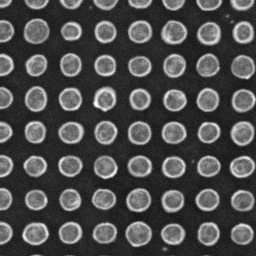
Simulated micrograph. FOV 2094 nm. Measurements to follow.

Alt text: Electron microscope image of a regular array of raised bodies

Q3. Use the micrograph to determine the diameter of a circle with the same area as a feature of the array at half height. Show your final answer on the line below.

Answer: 177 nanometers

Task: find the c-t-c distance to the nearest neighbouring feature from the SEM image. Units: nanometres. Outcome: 272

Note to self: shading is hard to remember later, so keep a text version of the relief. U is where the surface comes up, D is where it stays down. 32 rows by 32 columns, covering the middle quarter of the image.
UUUUDDDDUUUUUDDDUUUUUUDDDUUUUUDD
UUUUDDDDUUUUUDDDDUUUUUDDDUUUUUDD
UUUDDDDDDUUUDDDDDUUUUDDDDDUUUDDD
DDDDDDDDDDDDDDDDDDDDDDDDDDDDDDDD
DDDDDDDDDDDDDDDDDDDDDDDDDDDDDDDD
DDDDDDDDDDDDDDDDDDDDDDDDDDDDDDDD
UUUDDDDDDUUUDDDDDDUUDDDDDDDDDDDD
UUUUDDDDUUUUDDDDDUUUUDDDDDUUUUDD
UUUUDDDDUUUUUDDDDUUUUUDDDUUUUUDD
UUUUDDDDUUUUUDDDDUUUUUDDDUUUUUDD
UUUUDDDDUUUUDDDDDUUUUDDDDUUUUUDD
DDDDDDDDDDUDDDDDDDDDDDDDDDUUUDDD
DDDDDDDDDDDDDDDDDDDDDDDDDDDDDDDD
DDDDDDDDDDDDDDDDDDDDDDDDDDDDDDDD
DDDDDDDDDUUDDDDDDDDDDDDDDDDDDDDD
UUUUDDDDUUUUUDDDDUUUUDDDDUUUUDDD
UUUUUDDDUUUUUDDDUUUUUUDDDUUUUUDD
UUUUUDDDUUUUUDDDUUUUUUDDDUUUUUDD
UUUUDDDDUUUUUDDDUUUUUUDDDUUUUUDD
UUUDDDDDDUUUDDDDDUUUUDDDDDUUUDDD
DDDDDDDDDDDDDDDDDDDDDDDDDDDDDDDD
DDDDDDDDDDDDDDDDDDDDDDDDDDDDDDDD
DDDDDDDDDDDDDDDDDDDDDDDDDDDDDDDD
UUUDDDDDDUUUDDDDDDUUUDDDDDDDDDDD
UUUUDDDDUUUUUDDDDUUUUUDDDUUUUUDD
UUUUDDDDUUUUUDDDUUUUUUDDDUUUUUDD
UUUUDDDDUUUUUDDDUUUUUUDDDUUUUUDD
UUUDDDDDUUUUUDDDDDUUUDDDDUUUUDDD
DDDDDDDDDDUDDDDDDDDDDDDDDDDDDDDD
DDDDDDDDDDDDDDDDDDDDDDDDDDDDDDDD
DDDDDDDDDDDDDDDDDDDDDDDDDDDDDDDD
DDDDDDDDDUUDDDDDDDUUDDDDDDDDDDDD